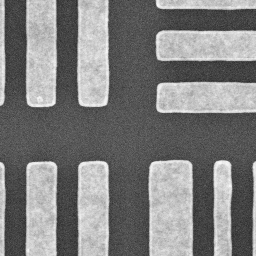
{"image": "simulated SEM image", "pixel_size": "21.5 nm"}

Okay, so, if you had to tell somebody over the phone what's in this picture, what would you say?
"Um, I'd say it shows groups of lines, slits or small figures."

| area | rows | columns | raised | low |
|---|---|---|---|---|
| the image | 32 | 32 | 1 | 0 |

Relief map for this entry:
00001110001110000000111111111111
00001110001110000000000000000000
00011110001110000000000000000000
00011110001110000000000000000000
00001110001110000000111111111111
00001110001110000000111111111111
00001110001110000000111111111111
00001110001110000000000000000000
00011110001110000000000000000000
00011110001110000000000000000000
00011110001110000000111111111111
00011110001110000000111111111111
00001110001110000000111111111111
00000000000000000000111111111111
00000000000000000000000000000000
00000000000000000000000000000000
00000000000000000000000000000000
00000000000000000000000000000000
00000000000000000000000000000000
00000000000000000000000000000000
00001110001110000001111100010000
00001110001110000001111100011000
00001110001110000001111100011000
00001110001110000001111100011000
10001110001110000001111100011000
00011110001110000001111100011000
00011110001110000001111100011000
00001110001110000001111100011000
00001110001110000001111100011000
00011110001110000001111100011000
00011110001110000001111100011000
00011110001110000001111100011000